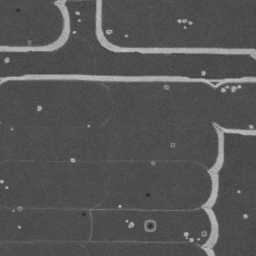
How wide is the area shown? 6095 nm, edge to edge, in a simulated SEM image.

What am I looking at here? wiring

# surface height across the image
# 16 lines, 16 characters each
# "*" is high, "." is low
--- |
****..**********
****..**********
****..**********
................
................
****************
****************
****************
**************..
**************..
**************..
*************...
*************...
*************...
*************...
*************...